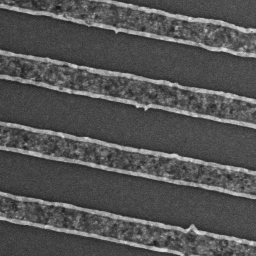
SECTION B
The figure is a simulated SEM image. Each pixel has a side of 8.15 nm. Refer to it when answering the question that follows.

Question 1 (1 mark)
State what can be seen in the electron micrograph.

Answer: one or a few lines or trenches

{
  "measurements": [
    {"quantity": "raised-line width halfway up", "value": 196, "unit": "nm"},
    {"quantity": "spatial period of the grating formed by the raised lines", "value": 566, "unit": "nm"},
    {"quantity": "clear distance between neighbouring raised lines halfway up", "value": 0.369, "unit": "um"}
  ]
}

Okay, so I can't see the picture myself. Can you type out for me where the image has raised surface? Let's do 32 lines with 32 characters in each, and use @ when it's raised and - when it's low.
@@@@@@@@@@@@@@@-----------------
----@@@@@@@@@@@@@@@@------------
---------@@@@@@@@@@@@@@@@-------
--------------@@@@@@@@@@@@@@@@--
-------------------@@@@@@@@@@@@@
-------------------------@@@@@@@
-----------------------------@@@
@@@@@@--------------------------
@@@@@@@@@@@---------------------
@@@@@@@@@@@@@@@@----------------
-----@@@@@@@@@@@@@@@@-----------
---------@@@@@@@@@@@@@@@@@------
---------------@@@@@@@@@@@@@@@@-
--------------------@@@@@@@@@@@@
-------------------------@@@@@@@
-------------------------------@
@@@@@@--------------------------
@@@@@@@@@@@---------------------
@@@@@@@@@@@@@@@-----------------
-----@@@@@@@@@@@@@@@@@----------
-----------@@@@@@@@@@@@@@@------
---------------@@@@@@@@@@@@@@@@-
---------------------@@@@@@@@@@@
--------------------------@@@@@@
@------------------------------@
@@@@@@@-------------------------
@@@@@@@@@@@@--------------------
-@@@@@@@@@@@@@@@@---------------
------@@@@@@@@@@@@@@@@----------
------------@@@@@@@@@@@@@@@-----
----------------@@@@@@@@@@@@@@@@
---------------------@@@@@@@@@@@